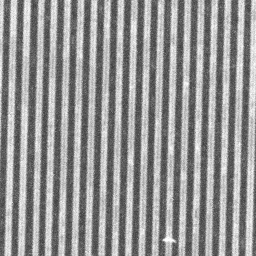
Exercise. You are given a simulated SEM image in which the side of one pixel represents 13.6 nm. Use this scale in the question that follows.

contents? parallel lines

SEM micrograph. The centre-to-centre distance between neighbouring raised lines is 182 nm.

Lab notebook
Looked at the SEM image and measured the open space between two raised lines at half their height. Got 0.121 um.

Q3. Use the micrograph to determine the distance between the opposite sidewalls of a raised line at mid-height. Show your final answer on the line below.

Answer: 71.4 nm